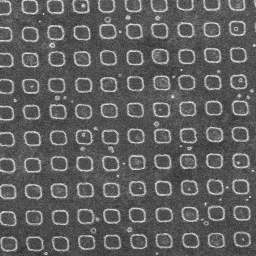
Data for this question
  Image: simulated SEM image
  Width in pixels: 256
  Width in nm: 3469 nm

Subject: a regular array of raised bodies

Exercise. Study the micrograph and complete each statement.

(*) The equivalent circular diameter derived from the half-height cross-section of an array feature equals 0.211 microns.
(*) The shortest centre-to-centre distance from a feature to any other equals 0.348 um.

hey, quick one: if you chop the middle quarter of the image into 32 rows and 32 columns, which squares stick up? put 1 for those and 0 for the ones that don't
00000000000000000000000000000000
00000000000000000000000000000000
00000000000000000000000000000000
00000000000000001110000111000111
00011110011110001111000111000111
00011110011110001111000111000111
00011110001110000000000000000000
00000000000000000000000000000000
00000000000000000000000000000000
00000000000000000000000000000000
00011100011110001110000111000111
00011110011110001111000111000111
00011110001110001111000111000011
00000000000000000000000000000000
00000000000000000000000000000000
00000000000000000000000000000000
00000000000000000110000100000111
00011110001110001111000111000111
00011110001110001111000111000111
00011110001110000111000111000010
00000000000000000000000000000000
00000000000000000000000000000000
00000000000000000000000000000000
00001110001110001111000111000111
10011110001110001111000111000111
10011110001111001111000111000011
00001100000010000000000000000000
00000000000000000000000000000000
00000000000000000000000000000000
00000000000000000000000111000011
00011110001110000111000111100111
10011110001111000111000111100011